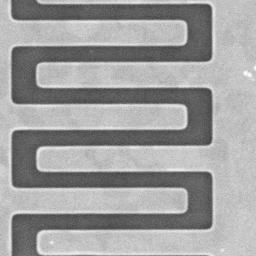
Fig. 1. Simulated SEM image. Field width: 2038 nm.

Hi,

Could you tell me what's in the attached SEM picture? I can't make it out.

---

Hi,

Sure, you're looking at groups of lines, slits or small figures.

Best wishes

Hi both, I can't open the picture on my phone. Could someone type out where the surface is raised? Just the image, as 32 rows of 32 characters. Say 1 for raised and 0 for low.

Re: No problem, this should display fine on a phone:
10000000000000000000000000111111
10000000000000000000000000011111
11000000000000000000000000011111
11111111111111111111111000011111
11111111111111111111111000011111
11111111111111111111111000011111
10000000000000000000000000011111
10000000000000000000000000111111
10000111111111111111111111111111
10000111111111111111111111111111
10000111111111111111111111111111
10000000000000000000000000111111
10000000000000000000000000011111
11111111111111111111111000011111
11111111111111111111111000011111
11111111111111111111111000011111
11000000000000000000000000011111
10000000000000000000000000011111
10000111111111111111111111111111
10000111111111111111111111111111
10000111111111111111111111111111
10000000000000000000000000111111
10000000000000000000000000011111
11000000000000000000000000011111
11111111111111111111111000011111
11111111111111111111111000011111
11111111111111111111111000011111
10000000000000000000000000011111
10000000000000000000000000111111
10000111111111111111111111111111
10000111111111111111111111111111
10000111111111111111111111111111